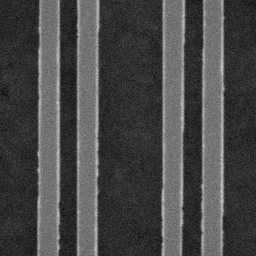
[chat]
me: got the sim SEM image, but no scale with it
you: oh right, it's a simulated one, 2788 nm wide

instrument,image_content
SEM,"lines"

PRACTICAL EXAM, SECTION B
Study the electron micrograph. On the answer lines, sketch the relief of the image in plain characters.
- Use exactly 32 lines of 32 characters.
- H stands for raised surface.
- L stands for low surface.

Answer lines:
LLLLLHHLLLHHLLLLLLLLHHHLLHHHLLLL
LLLLLHHLLLHHLLLLLLLLHHHLLHHHLLLL
LLLLLHHLLLHHLLLLLLLLHHHLLHHHLLLL
LLLLLHHLLLHHLLLLLLLLHHHLLHHHLLLL
LLLLLHHLLLHHLLLLLLLLHHHLLHHHLLLL
LLLLLHHLLLHHLLLLLLLLHHHLLHHHLLLL
LLLLLHHLLLHHLLLLLLLLHHHLLHHHLLLL
LLLLLHHLLLHHLLLLLLLLHHHLLHHHLLLL
LLLLLHHLLLHHLLLLLLLLHHHLLHHHLLLL
LLLLLHHLLLHHLLLLLLLLHHHLLHHHLLLL
LLLLLHHLLLHHLLLLLLLLHHHLLHHHLLLL
LLLLLHHLLLHHLLLLLLLLHHHLLHHHLLLL
LLLLLHHLLLHHLLLLLLLLHHHLLHHHLLLL
LLLLLHHLLLHHLLLLLLLLHHHLLHHHLLLL
LLLLLHHLLLHHLLLLLLLLHHHLLHHHLLLL
LLLLLHHLLLHHLLLLLLLLHHHLLHHHLLLL
LLLLLHHLLLHHLLLLLLLLHHHLLHHHLLLL
LLLLLHHLLLHHLLLLLLLLHHHLLHHHLLLL
LLLLLHHLLLHHLLLLLLLLHHHLLHHHLLLL
LLLLLHHLLLHHLLLLLLLLHHHLLHHHLLLL
LLLLLHHLLLHHLLLLLLLLHHHLLHHHLLLL
LLLLLHHLLLHHLLLLLLLLHHHLLHHHLLLL
LLLLLHHLLLHHLLLLLLLLHHHLLHHHLLLL
LLLLLHHLLLHHLLLLLLLLHHHLLHHHLLLL
LLLLLHHLLLHHLLLLLLLLHHHLLHHHLLLL
LLLLLHHLLLHHLLLLLLLLHHHLLHHHLLLL
LLLLLHHLLLHHLLLLLLLLHHHLLHHHLLLL
LLLLLHHLLLHHLLLLLLLLHHHLLHHHLLLL
LLLLLHHLLLHHLLLLLLLLHHHLLHHHLLLL
LLLLLHHLLLHHLLLLLLLLHHHLLHHHLLLL
LLLLLHHLLLHHLLLLLLLLHHHLLHHHLLLL
LLLLLHHLLLHHLLLLLLLLHHHLLHHHLLLL